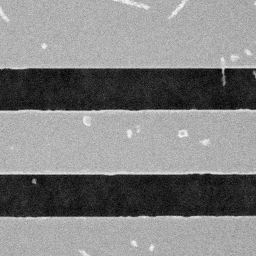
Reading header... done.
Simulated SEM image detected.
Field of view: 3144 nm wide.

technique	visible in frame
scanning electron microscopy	lines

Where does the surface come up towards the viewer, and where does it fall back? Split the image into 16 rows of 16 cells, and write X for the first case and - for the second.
XXXXXXXXXXXXXXXX
XXXXXXXXXXXXXXXX
XXXXXXXXXXXXXXXX
XXXXXXXXXXXXXXXX
----------------
----------------
----------------
XXXXXXXXXXXXXXXX
XXXXXXXXXXXXXXXX
XXXXXXXXXXXXXXXX
XXXXXXXXXXXXXXXX
----------------
----------------
----------------
XXXXXXXXXXXXXXXX
XXXXXXXXXXXXXXXX